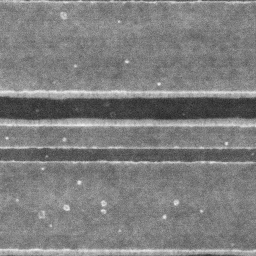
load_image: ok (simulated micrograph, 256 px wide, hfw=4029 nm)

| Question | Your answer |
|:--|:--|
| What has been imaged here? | lines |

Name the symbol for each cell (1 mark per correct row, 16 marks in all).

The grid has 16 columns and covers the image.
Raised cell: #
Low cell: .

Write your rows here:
################
################
################
################
################
################
................
................
################
################
################
################
################
################
################
################